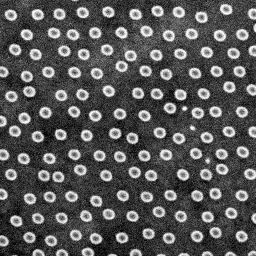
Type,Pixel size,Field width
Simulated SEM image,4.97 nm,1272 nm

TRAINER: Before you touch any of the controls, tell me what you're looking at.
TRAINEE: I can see a regular array of raised bodies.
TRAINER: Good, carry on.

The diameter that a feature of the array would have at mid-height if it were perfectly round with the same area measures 54.3 nanometres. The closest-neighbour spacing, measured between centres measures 99.3 nm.